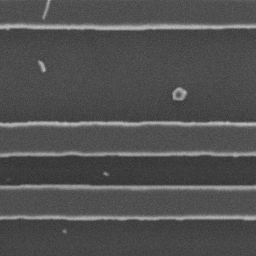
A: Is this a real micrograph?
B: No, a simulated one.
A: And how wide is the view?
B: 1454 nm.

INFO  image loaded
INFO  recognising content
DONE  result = lines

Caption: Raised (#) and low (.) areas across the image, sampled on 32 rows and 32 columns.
################################
################################
################################
......##############....#.##....
................................
................................
................................
................................
................................
................................
................................
................................
................................
................................
................................
..##############################
################################
################################
################################
#...............................
................................
................................
................................
################################
################################
################################
################################
................................
................................
................................
................................
................................